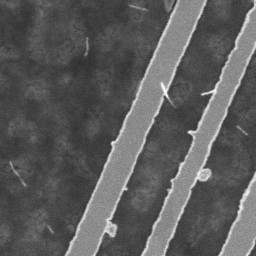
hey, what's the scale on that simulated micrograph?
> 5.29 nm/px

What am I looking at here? one or a few lines or trenches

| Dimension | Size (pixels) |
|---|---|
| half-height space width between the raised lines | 43.8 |